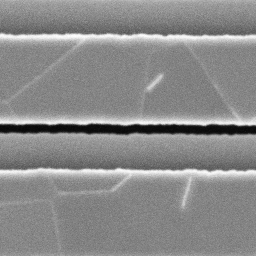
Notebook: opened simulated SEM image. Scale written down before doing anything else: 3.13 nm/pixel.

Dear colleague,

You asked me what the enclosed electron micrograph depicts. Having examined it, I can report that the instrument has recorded lines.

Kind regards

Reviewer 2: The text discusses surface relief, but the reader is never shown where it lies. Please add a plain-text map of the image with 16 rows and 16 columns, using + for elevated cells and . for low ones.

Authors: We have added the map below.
................
................
++++++++++++++++
++++++++++++++++
++++++++++++++++
++++++++++++++++
++++++++++++++++
++++++++++++++++
................
................
................
++++++++++++++++
++++++++++++++++
++++++++++++++++
++++++++++++++++
++++++++++++++++